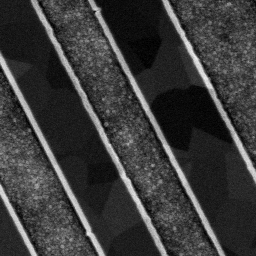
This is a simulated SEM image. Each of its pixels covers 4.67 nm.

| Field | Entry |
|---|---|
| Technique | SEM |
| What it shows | one or a few lines or trenches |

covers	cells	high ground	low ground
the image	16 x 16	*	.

**....*****.....
***...*****.....
***....*****....
****...*****....
****....*****...
.****...*****...
.****....*****..
..****....****..
..****....*****.
...****....****.
....****...*****
....****....****
.....****...****
*....****....***
*.....****...***
**....****....**